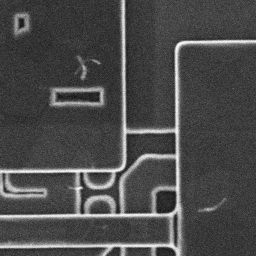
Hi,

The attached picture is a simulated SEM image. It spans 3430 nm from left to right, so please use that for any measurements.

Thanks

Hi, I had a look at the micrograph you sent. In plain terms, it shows wiring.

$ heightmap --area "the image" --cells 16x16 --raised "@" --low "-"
@@@@@@@@--------
@@@@@@@@--------
@@@@@@@@--------
@@@@@@@@---@@@@@
@@@@@@@@---@@@@@
@@@@@@@@---@@@@@
@@@@@@@@---@@@@@
@@@@@@@@---@@@@@
@@@@@@@@---@@@@@
@@@@@@@@---@@@@@
@@@@@@@----@@@@@
-----------@@@@@
-----------@@@@@
@@@@@@@@@@@@@@@@
@@@@@@@@@@@@@@@@
-----------@@@@@